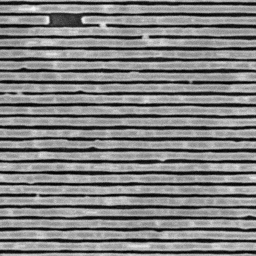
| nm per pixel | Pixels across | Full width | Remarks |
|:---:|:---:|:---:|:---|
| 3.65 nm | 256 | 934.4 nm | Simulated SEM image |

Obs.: parallel lines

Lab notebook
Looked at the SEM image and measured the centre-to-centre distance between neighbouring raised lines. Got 41.2 nanometers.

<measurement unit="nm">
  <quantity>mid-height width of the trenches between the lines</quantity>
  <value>14.1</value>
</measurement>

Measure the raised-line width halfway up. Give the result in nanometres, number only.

25.1